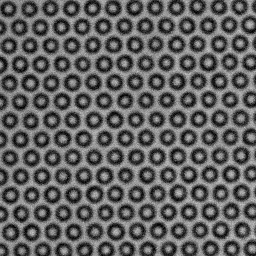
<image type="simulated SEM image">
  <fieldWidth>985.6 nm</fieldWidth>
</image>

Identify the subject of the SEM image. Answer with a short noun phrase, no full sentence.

a regular array of ring-shaped grooves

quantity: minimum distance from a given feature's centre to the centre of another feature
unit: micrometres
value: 0.079